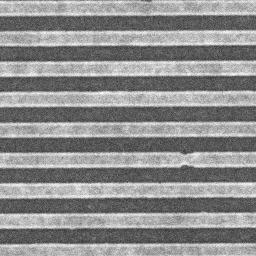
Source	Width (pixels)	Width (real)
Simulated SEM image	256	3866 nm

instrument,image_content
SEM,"parallel lines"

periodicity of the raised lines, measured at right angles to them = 459 nm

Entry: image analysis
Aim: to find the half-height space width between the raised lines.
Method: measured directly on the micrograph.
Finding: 278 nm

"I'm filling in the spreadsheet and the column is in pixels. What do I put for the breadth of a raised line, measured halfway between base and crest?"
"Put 11.4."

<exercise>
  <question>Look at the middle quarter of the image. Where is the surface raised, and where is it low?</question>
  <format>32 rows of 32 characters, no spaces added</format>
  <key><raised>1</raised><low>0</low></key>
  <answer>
11111111111111111111111111111111
11111111111111111111111111111111
11111000000000000000000000000000
00000000000000000000000000000000
00000000000000000000000000000000
00000000000000000000000000000000
00000000000000000000000000000000
11111000111111111111111111111111
11111111111111111111111111111111
11111111111111111111111111111111
00000000000000000000000000000000
00000000000000000000000000000000
00000000000000000000000000000000
00000000000000000000000000000000
00000000000000000000000000000000
11111111111111111111111111111111
11111111111111111111111111111111
11111111111111111111111111111111
00000000000000000000000000000000
00000000000000000000000000000000
00000000000000000000000000000000
00000000000000000000000000000000
00000000000000000000000000000000
11111111111111111111111111111111
11111111111111111111111111111111
00000000000000000000000000000000
00000000000000000000000000000000
00000000000000000000000000000000
00000000000000000000000000000000
00000000000000000000000000000000
11111111111111111111111111111111
11111111111111111111111111111111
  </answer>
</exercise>